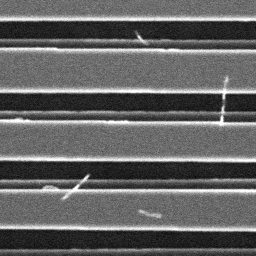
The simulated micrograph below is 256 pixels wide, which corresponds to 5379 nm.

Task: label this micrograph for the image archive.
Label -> lines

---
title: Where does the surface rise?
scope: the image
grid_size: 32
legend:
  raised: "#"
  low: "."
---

################################
################################
................##............##
................................
................................
################################
################################
################################
################################
################################
################################
..............##################
................................
................................
################################
################################
################################
################################
################################
################################
................................
................................
..........#..................#.#
################################
################################
################################
################################
################################
........########################
................................
................................
################################